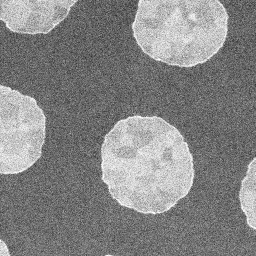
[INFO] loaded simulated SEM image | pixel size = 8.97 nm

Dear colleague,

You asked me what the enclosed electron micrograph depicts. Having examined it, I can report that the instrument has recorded raised bodies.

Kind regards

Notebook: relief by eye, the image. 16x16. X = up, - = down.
XXXX-----XXXXX--
XXXX----XXXXXX--
---------XXXXX--
---------XXXX---
----------------
----------------
XX--------------
XXX-----XX------
XXX----XXXX-----
XXX---XXXXXX----
XX----XXXXXX----
-------XXXXX---X
-------XXXX----X
---------------X
----------------
----------------